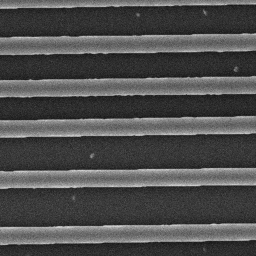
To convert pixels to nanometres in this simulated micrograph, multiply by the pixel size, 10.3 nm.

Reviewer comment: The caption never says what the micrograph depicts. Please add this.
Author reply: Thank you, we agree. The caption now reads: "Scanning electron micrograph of lines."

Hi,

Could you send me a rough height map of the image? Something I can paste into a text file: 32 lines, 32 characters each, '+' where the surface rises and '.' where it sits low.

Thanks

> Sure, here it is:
++++++++++++++++++++++++++++....
................................
................................
................................
..................++++++++++++++
++++++++++++++++++++++++++++++++
++++++++++++++++++++............
................................
................................
................................
++++++++++++++++++++++++++++++++
++++++++++++++++++++++++++++++++
................................
................................
................................
++++++++++++++++++++++++++++++++
++++++++++++++++++++++++++++++++
................................
................................
................................
................................
++++++++++++++++++++++++++++++++
++++++++++++++++++++++++++++++++
+...............................
................................
................................
................................
................................
++++++++++++++++++++++++++++++++
++++++++++++++++++++++++++++++++
+...............................
................................